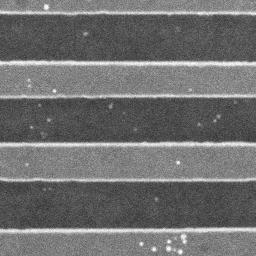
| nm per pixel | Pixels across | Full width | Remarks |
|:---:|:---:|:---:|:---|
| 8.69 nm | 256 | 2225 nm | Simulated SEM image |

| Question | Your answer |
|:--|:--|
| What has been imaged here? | lines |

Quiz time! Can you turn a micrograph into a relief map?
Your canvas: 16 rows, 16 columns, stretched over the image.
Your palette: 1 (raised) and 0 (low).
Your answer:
1111111111111111
0000000000000000
0000000000000000
0000000000000000
1111111111111111
1111111111111111
0000000000000000
0000000000000000
0000000000000000
1111111111111111
1111111111111111
0000000000000000
0000000000000000
0000000000000000
1111111111111111
1111111111111111